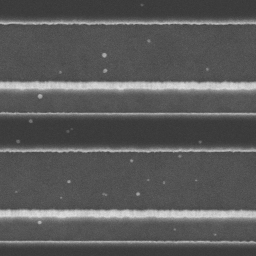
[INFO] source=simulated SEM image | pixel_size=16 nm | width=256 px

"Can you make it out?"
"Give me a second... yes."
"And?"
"lines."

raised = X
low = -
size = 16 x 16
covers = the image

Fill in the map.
XXXXXXXXXXXXXXXX
----------------
----------------
----------------
----------------
XXXXXXXXXXXXXXXX
XXXXXXXXXXXXXXXX
XXXXXXXXXXXXXXXX
XXXXXXXXXXXXXXXX
----------------
----------------
----------------
----------------
XXXXXXXXXXXXXXXX
XXXXXXXXXXXXXXXX
XXXXXXXXXXXXXXXX